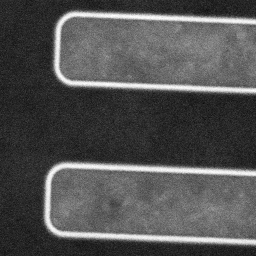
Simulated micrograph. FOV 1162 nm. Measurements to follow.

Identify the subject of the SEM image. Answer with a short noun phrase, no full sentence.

one or a few lines or trenches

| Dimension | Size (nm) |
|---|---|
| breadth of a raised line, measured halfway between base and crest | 381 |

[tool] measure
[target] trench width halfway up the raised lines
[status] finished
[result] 310 nanometers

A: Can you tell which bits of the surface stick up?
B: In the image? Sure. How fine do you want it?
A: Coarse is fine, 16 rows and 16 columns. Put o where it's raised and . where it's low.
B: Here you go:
oooooooooooooooo
oooo............
oooo............
oooo............
oooo............
ooooooooooooo...
oooooooooooooooo
oooooooooooooooo
oooooooooooooooo
oooooooooooooooo
oooo...ooooooooo
ooo.............
ooo.............
ooo.............
oooo............
oooooooooooooooo